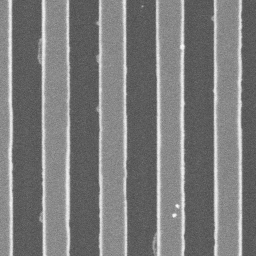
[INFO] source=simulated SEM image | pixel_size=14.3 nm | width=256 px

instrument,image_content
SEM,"lines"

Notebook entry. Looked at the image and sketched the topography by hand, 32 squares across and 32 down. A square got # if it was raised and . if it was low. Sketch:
#....####...####....###....###..
#....####...####....###....###..
#....####...####....###....###..
#....####...####....###....###..
#....####...####....###....###..
#....####...####....###....###..
#....####...####....###....###..
#....####...####....###....###..
#....####...####....###....###..
#....####...####....###....###..
#....####...####....###....###..
#....####...####....###....###..
#....####...####....###....###..
#....####...####....###....###..
##...####....###....###....###..
##...####....###....###....###..
##...####....###....###....###..
#....####...####....###....###..
#....####...####....###....###..
#....####...####....###....###..
#....####...####....###....###..
#....####...####....###....###..
#....####...####....###....###..
#....####....###....###....###..
##...####....###....###....###..
##...####...####....###....###..
##...####....###....###....###..
##...####....###....###....###..
##...####....###....###....###..
##...####....###....###....###..
##...####....###....###....###..
##...####....###....###....###..